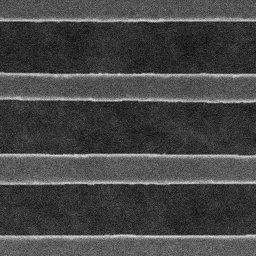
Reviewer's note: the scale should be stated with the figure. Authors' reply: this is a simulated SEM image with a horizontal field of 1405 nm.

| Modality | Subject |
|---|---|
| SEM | lines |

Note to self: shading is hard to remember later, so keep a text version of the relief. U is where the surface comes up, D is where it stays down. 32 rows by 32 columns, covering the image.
UUUUUUUUUUUUUUUUUUUUUUUUUUUUUUUU
UUUUUUUUUUUUUUUUUUUUUUUUUUUUUUUU
DUUUUUUUUUUDUUUUUUUUUUUDDDDDDDUU
DDDDDDDDDDDDDDDDDDDDDDDDDDDDDDDD
DDDDDDDDDDDDDDDDDDDDDDDDDDDDDDDD
DDDDDDDDDDDDDDDDDDDDDDDDDDDDDDDD
DDDDDDDDDDDDDDDDDDDDDDDDDDDDDDDD
DDDDDDDDDDDDDDDDDDDDDDDDDDDDDDDD
DDDDDDDDDDDDDDDDDDDDDDDDDDDDDDDD
UUUUUUUUUUUUUUUUUUUUUUUUUUUUUUUU
UUUUUUUUUUUUUUUUUUUUUUUUUUUUUUUU
UUUUUUUUUUUUUUUUUUUUUUUUUUUUUUUU
DDDDDDDDDDDUUUUDDDDDUUUUUUUUUUUU
DDDDDDDDDDDDDDDDDDDDDDDDDDDDDDDD
DDDDDDDDDDDDDDDDDDDDDDDDDDDDDDDD
DDDDDDDDDDDDDDDDDDDDDDDDDDDDDDDD
DDDDDDDDDDDDDDDDDDDDDDDDDDDDDDDD
DDDDDDDDDDDDDDDDDDDDDDDDDDDDDDDD
DDDDDDDDDDDDDDDDDDDDDDDDDDDDDDDD
UUUUUUUUUUUUUUUUUUUUUDUUUUUDDDDD
UUUUUUUUUUUUUUUUUUUUUUUUUUUUUUUU
UUUUUUUUUUUUUUUUUUUUUUUUUUUUUUUU
UUUUUUUUUUUUUUUUUUUUUUUUUUUUUUUU
DDDDDDDDDDDDDDDDDDDDDDDDDDDDDDDD
DDDDDDDDDDDDDDDDDDDDDDDDDDDDDDDD
DDDDDDDDDDDDDDDDDDDDDDDDDDDDDDDD
DDDDDDDDDDDDDDDDDDDDDDDDDDDDDDDD
DDDDDDDDDDDDDDDDDDDDDDDDDDDDDDDD
DDDDDDDDDDDDDDDDDDDDDDDDDDDDDDDD
DDDDDDDDDDDDDDUUDDDDDDDDDDDDDDDD
UUUUUUUUUUUUUUUUUUUUUUUUUUUUUUUU
UUUUUUUUUUUUUUUUUUUUUUUUUUUUUUUU